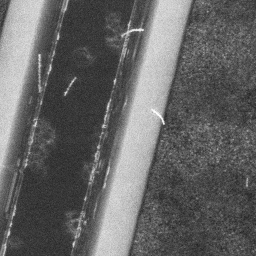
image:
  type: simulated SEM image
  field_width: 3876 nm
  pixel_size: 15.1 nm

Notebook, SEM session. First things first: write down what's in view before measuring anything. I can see one or a few lines or trenches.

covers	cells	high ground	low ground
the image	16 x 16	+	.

..+++++++++.....
..++++++++......
.+++++++++......
.+++++++++......
.+++++++++......
.++++++++.......
+++++++++.......
+++++++++.......
+++++++++.......
++++++++........
++++++++........
++++++++........
+++++++.........
+++++++.........
+++++++.........
+++++++.........